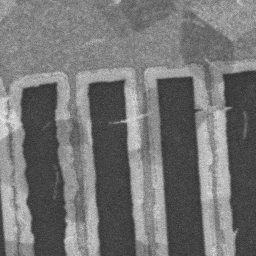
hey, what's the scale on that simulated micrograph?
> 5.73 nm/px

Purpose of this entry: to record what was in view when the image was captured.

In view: one or a few lines or trenches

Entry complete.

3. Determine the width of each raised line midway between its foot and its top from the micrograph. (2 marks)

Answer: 122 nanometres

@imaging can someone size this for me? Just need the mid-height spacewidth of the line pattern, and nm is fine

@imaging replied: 264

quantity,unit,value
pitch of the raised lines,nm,385